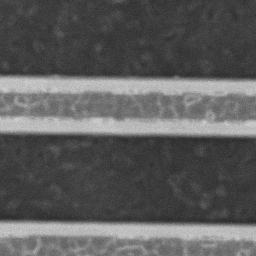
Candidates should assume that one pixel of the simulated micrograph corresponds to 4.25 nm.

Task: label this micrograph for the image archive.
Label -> one or a few lines or trenches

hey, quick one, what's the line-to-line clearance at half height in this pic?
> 437 nm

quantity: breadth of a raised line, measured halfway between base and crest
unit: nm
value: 182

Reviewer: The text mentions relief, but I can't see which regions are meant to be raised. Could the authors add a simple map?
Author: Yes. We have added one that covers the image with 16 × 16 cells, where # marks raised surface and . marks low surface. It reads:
................
................
................
................
................
################
################
################
................
................
................
................
................
................
##############..
################